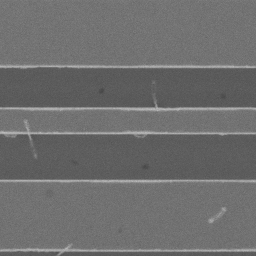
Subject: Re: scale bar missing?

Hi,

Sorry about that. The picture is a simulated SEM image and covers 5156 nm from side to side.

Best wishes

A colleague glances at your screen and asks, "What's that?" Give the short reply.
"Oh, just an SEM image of lines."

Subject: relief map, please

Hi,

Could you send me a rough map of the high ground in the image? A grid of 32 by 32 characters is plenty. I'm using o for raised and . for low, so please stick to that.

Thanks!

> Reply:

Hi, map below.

oooooooooooooooooooooooooooooooo
oooooooooooooooooooooooooooooooo
oooooooooooooooooooooooooooooooo
oooooooooooooooooooooooooooooooo
oooooooooooooooooooooooooooooooo
oooooooooooooooooooooooooooooooo
oooooooooooooooooooooooooooooooo
oooooooooooooooooooooooooooooooo
................................
................................
................................
................................
................................
...................o............
oooooooooooooooooooooooooooooooo
oooooooooooooooooooooooooooooooo
oooooooooooooooooooooooooooooooo
................................
................................
................................
................................
................................
................................
oooooooooooooooooooooooooooooooo
oooooooooooooooooooooooooooooooo
oooooooooooooooooooooooooooooooo
oooooooooooooooooooooooooooooooo
oooooooooooooooooooooooooooooooo
oooooooooooooooooooooooooooooooo
oooooooooooooooooooooooooooooooo
oooooooooooooooooooooooooooooooo
................................